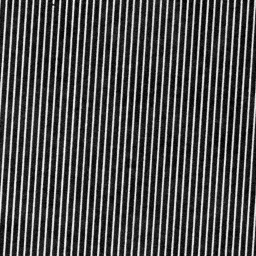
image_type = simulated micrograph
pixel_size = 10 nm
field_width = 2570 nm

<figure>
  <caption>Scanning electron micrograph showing parallel lines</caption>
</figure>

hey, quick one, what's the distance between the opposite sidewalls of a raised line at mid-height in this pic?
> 10 nm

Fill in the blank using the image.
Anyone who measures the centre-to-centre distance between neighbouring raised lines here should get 67.3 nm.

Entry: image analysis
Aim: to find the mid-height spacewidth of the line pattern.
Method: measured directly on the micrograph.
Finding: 53.8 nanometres